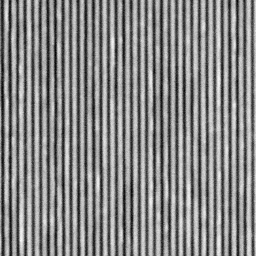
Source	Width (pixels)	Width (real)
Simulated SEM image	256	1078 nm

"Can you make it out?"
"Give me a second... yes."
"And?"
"parallel lines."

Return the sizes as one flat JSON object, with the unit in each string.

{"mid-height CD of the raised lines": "4.37 pixels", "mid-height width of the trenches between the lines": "15.3 nm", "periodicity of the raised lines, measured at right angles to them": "31.9 nm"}